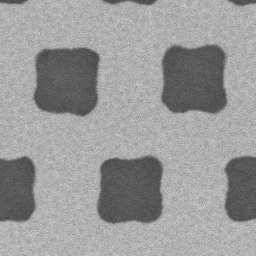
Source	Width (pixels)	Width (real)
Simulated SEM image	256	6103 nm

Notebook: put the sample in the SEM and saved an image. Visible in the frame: holes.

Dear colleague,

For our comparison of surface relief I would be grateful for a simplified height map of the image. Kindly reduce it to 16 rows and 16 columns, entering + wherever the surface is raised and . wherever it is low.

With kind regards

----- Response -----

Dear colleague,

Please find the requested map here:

++++++++++++++++
++++++++++++++++
++++++++++++++++
++....++++....++
++....++++....++
++....++++....++
++....++++....++
++++++++++++++++
++++++++++++++++
++++++++++++++++
..++++....++++..
..++++....++++..
..++++....++++..
..++++....++++..
++++++++++++++++
++++++++++++++++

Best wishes